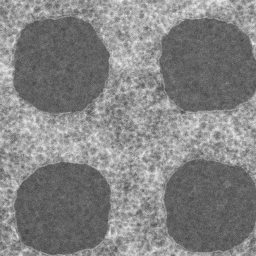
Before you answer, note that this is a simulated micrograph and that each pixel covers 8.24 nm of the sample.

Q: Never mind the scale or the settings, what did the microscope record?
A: raised bodies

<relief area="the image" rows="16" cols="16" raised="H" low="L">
LLLLLLLLLLLLLLLL
LLHHHHLLLLLHHHHL
LHHHHHLLLLHHHHHH
LHHHHHHLLLHHHHHH
LHHHHHHLLLHHHHHH
LHHHHHHLLLHHHHHH
LLHHHHLLLLLHHHHL
LLLLLLLLLLLLLLLL
LLLLLLLLLLLLLHLL
LLLLLLLLLLLLLLLL
LLHHHHLLLLLHHHHL
LHHHHHHLLLHHHHHH
LHHHHHHLLLHHHHHH
LHHHHHHLLLHHHHHH
LHHHHHHLLLHHHHHH
LLHHHHLLLLLLHHHL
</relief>